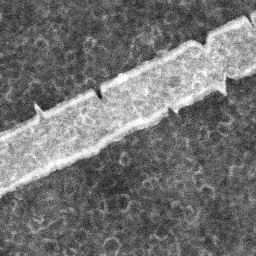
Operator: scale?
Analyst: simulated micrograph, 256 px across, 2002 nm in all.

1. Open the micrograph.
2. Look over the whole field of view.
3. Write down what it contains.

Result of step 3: one or a few lines or trenches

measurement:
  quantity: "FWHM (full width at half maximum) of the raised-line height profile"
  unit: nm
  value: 366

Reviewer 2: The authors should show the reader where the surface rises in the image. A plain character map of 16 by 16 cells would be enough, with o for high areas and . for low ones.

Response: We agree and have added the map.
................
...............o
.............ooo
...........ooooo
.........oooooo.
.......oooooo...
....ooooooo.....
..ooooooo.......
ooooooo.........
ooooo...........
ooo.............
o...............
................
................
................
................